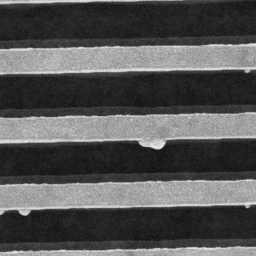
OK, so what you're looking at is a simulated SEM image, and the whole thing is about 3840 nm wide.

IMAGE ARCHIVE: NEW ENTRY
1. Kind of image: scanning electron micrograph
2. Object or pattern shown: lines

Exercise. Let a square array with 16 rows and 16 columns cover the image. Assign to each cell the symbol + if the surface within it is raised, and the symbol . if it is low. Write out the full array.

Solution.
................
................
......++++++++++
++++++++++++++++
+++++++.........
................
................
++++++++++++++++
++++++++++++++++
................
................
++++++++++++++++
++++++++++++++++
................
................
++++++++++++++++